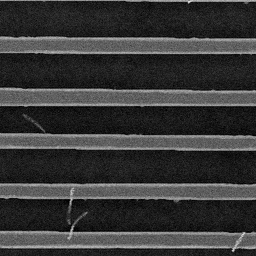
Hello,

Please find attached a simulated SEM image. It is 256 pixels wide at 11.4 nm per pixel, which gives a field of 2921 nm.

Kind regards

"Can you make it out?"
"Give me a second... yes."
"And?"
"lines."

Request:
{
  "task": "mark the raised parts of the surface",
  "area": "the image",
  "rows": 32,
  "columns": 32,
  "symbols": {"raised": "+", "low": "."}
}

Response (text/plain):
................................
................................
................................
................................
................................
++++++++++++++++++++++++++++++++
++++++++++++++++++++++++++++++++
................................
................................
................................
................................
++++++++++++++++++++++++++++++++
++++++++++++++++++++++++++++++++
................................
................................
................................
................................
++++++++++++++++++++++++++++++++
++++++++++++++++++++++++++++++++
................................
................................
................................
................................
++++++++++++++++++++++++++++++++
++++++++++++++++++++++++++++++++
................................
................................
................................
................................
++++++++++++++++++++++++++++++++
++++++++++++++++++++++++++++++++
................................